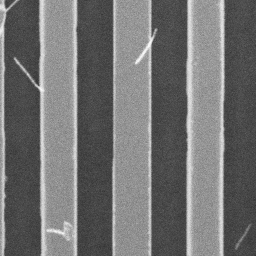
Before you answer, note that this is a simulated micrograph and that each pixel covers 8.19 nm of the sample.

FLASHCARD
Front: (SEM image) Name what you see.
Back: lines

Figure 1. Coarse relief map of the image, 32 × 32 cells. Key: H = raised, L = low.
HLLLLHHHHLLLLLHHHHHLLLLLHHHHLLLL
HLLLLHHHHHLLLLHHHHHLLLLLHHHHLLLL
HLLLLHHHHHLLLLHHHHHLLLLLHHHHLLLL
LLLLLHHHHLLLLLHHHHHLLLLLHHHHLLLL
LLLLLHHHHLLLLLHHHHHLLLLLHHHHLLLL
LLLLLHHHHHLLLLHHHHHLLLLLHHHHLLLL
LLLLLHHHHHLLLLHHHHHLLLLLHHHHLLLL
LLLLLHHHHHLLLLHHHHHLLLLLHHHHLLLL
HLLLLHHHHLLLLLHHHHHLLLLHHHHHLLLL
LLLLLHHHHHLLLLHHHHHLLLLLHHHHLLLL
LLLLLHHHHHLLLLHHHHHLLLLLHHHHLLLL
LLLLLHHHHHLLLLHHHHHLLLLLHHHHLLLL
LLLLLHHHHHLLLLHHHHHLLLLLHHHHLLLL
LLLLLHHHHHLLLLHHHHHLLLLLHHHHLLLL
LLLLLHHHHHLLLLHHHHHLLLLLHHHHLLLL
LLLLLHHHHHLLLLHHHHHLLLLLHHHHLLLL
HLLLLHHHHHLLLLHHHHHLLLLLHHHHLLLL
HLLLLHHHHHLLLLHHHHHLLLLLHHHHLLLL
HLLLLHHHHHLLLLHHHHHLLLLLHHHHLLLL
LLLLLHHHHHLLLLHHHHHLLLLLHHHHLLLL
LLLLLHHHHHLLLLHHHHHLLLLLHHHHLLLL
LLLLLHHHHHLLLLHHHHHLLLLLHHHHLLLL
LLLLLHHHHHLLLLHHHHHLLLLLHHHHLLLL
LLLLLHHHHHLLLLHHHHHLLLLLHHHHLLLL
LLLLLHHHHHLLLLHHHHHLLLLHHHHHLLLL
LLLLLHHHHHLLLLHHHHHLLLLLHHHHLLLL
LLLLLHHHHHLLLLHHHHHLLLLHHHHHLLLL
LLLLLHHHHHLLLLHHHHHLLLLHHHHHLLLL
LLLLLHHHHHLLLLHHHHHLLLLHHHHHLLLL
LLLLLHHHHHLLLLHHHHHLLLLHHHHHLLLL
LLLLLHHHHHLLLLHHHHHLLLLHHHHHLLLL
LLLLLHHHHHLLLLHHHHHLLLLHHHHHLLLL